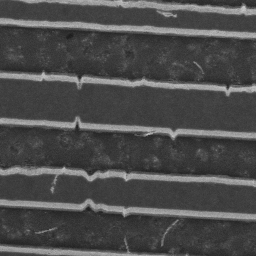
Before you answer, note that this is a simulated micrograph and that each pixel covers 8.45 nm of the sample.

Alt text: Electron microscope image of one or a few lines or trenches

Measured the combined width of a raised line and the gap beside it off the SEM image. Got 744 nanometres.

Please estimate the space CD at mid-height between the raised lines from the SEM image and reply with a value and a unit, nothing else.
413 nanometres